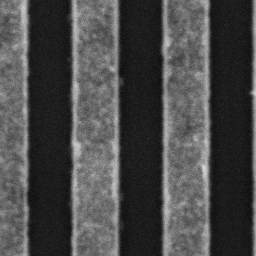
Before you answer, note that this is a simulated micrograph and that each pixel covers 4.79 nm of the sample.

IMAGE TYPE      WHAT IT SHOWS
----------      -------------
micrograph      one or a few lines or trenches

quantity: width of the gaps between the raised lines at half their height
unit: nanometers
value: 234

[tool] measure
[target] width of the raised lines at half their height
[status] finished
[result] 202 nm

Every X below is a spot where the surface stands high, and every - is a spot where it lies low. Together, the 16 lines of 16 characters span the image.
XX---XX---XXX---
XX---XX---XXX---
XX---XX---XXX---
XX---XX---XXX---
XX---XX---XXX---
XX---XX---XXX---
XX---XX---XXX---
XX---XX---XXX---
XX---XX---XXX---
XX---XX---XXX---
XX---XX---XXX---
XX---XX---XXX---
XX---XX---XXX---
XX---XX---XXX---
XX---XX---XXX---
XX---XX---XXX---